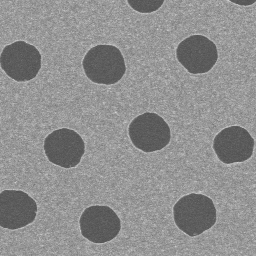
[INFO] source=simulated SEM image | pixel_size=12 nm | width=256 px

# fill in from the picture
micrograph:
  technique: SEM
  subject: holes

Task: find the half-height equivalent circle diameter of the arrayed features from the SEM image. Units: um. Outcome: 0.477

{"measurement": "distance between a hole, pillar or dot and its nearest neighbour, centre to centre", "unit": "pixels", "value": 81.6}